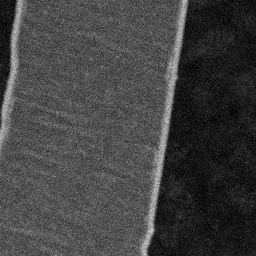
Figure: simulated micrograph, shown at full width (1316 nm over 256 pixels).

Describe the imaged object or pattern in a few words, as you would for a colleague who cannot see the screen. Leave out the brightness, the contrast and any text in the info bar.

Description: one or a few lines or trenches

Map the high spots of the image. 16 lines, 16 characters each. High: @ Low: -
-@@@@@@@@@@-----
-@@@@@@@@@@-----
-@@@@@@@@@@-----
-@@@@@@@@@@-----
-@@@@@@@@@@-----
-@@@@@@@@@@-----
@@@@@@@@@@@-----
@@@@@@@@@@------
@@@@@@@@@@------
@@@@@@@@@@------
@@@@@@@@@@------
@@@@@@@@@@------
@@@@@@@@@@------
@@@@@@@@@-------
@@@@@@@@@-------
@@@@@@@@@-------